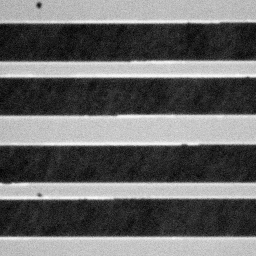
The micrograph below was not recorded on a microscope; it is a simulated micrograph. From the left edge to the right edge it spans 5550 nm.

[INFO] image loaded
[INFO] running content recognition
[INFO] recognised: lines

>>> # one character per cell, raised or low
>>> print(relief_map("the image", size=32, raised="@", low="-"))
@@@@@@@@@@@@@@@@@@@@@@@@@@@@@@@@
@@@@@@@@@@@@@@@@@@@@@@@@@@@@@@@@
@@@@@@@@@@@@@@@@@@@@@@@@@@@@@@@@
--------------------------------
--------------------------------
--------------------------------
--------------------------------
--------------------------------
@@@@@@@@@@@@@@@@@@@@@@@@@@@@@@@@
@@@@@@@@@@@@@@@@@@@@@@@@@@@@@@-@
--------------------------------
--------------------------------
--------------------------------
--------------------------------
--------------@@@@@@@@@@@@@@@@@@
@@@@@@@@@@@@@@@@@@@@@@@@@@@@@@@@
@@@@@@@@@@@@@@@@@@@@@@@@@@@@@@@@
@@@@@@@@@@@@@@@@@@@@@@@@@@@@@@@@
--------------------------------
--------------------------------
--------------------------------
--------------------------------
--------------------------------
@@@@@@@@@@@@@@@@@@@@@@@@@@@@@@@@
@@@@@@@@@@@@@@@@@@@@@@@@@@@@@@@@
--------------------------------
--------------------------------
--------------------------------
--------------------------------
--------------------------------
@@@@@@@@@@@@@@@@@@@@@@@@@@@@@@@@
@@@@@@@@@@@@@@@@@@@@@@@@@@@@@@@@